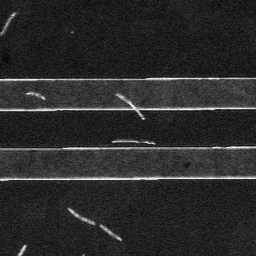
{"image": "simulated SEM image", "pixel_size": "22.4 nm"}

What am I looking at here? lines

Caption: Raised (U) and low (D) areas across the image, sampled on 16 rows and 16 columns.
DDDDDDDDDDDDDDDD
DDDDDDDDDDDDDDDD
DDDDDDDDDDDDDDDD
DDDDDDDDDDDDDDDD
DDDDDDDDDDDDDDDD
UUUUUUUUUUUUUUUU
UUUUUUUUUUUUUUUU
DDDDDDDDDDDDDDDD
DDDDDDDDDDDDDDDD
UUUUUUUUUUUUUUUU
UUUUUUUUUUUUUUUU
DDDDDDDDDDDDDDDD
DDDDDDDDDDDDDDDD
DDDDDDDDDDDDDDDD
DDDDDDDDDDDDDDDD
DDDDDDDDDDDDDDDD